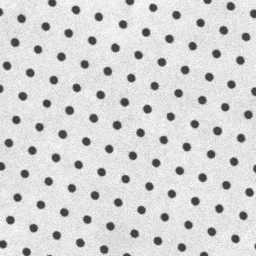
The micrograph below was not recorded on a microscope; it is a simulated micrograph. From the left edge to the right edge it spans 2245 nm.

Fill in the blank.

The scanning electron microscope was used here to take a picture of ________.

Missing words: a regular array of holes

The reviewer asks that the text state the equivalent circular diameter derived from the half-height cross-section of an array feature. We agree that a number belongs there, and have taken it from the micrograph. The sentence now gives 0.0747 µm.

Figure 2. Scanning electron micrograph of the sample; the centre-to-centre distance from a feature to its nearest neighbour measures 211 nm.